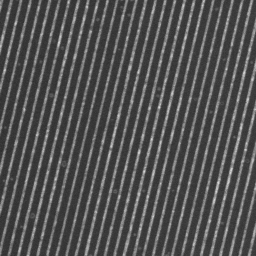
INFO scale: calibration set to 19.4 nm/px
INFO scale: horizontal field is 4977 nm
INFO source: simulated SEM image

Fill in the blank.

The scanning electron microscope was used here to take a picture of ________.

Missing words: parallel lines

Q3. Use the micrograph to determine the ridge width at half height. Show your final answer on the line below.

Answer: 0.0379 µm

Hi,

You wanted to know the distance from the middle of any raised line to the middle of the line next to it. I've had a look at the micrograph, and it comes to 182 nanometers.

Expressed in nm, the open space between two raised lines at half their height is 140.